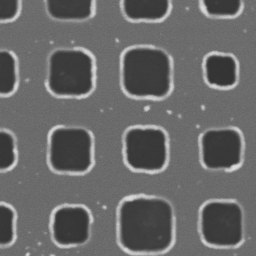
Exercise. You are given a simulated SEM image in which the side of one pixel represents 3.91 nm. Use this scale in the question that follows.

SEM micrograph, a regular array of holes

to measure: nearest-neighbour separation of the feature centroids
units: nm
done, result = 294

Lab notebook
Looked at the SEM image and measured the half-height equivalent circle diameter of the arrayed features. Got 42.7 px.